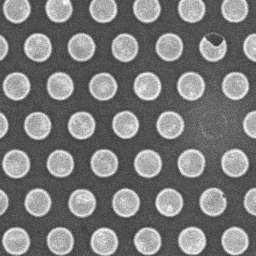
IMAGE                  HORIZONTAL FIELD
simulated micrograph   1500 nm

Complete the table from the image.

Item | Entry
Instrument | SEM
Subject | a regular array of raised bodies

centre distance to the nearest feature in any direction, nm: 254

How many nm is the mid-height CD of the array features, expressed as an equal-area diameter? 159